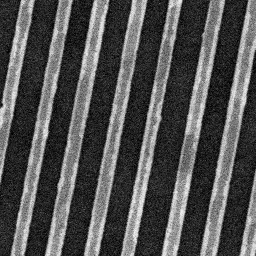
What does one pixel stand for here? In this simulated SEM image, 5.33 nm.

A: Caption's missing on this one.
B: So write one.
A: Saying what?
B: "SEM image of parallel lines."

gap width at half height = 130 nm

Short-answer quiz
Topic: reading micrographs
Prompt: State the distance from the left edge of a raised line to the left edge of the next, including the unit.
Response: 37.4 px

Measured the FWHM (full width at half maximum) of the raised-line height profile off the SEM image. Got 67.4 nm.